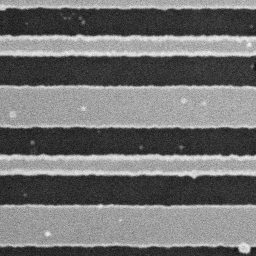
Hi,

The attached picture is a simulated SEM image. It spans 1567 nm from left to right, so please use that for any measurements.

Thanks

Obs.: lines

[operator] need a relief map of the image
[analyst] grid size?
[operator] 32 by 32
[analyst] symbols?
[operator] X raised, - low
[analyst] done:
XXXXXXXXXXXXXXXXXXXXXXXXXXXXXXXX
--------------------------------
--------------------------------
--------------------------------
XXXX-XXXXXX-XXX-XX--XX----XXX---
XXXXXXXXXXXXXXXXXXXXXXXXXXXXXXXX
XXXXXXXXXXXXXXXXXXXXXXXXXXXXXXXX
--------------------------------
--------------------------------
--------------------------------
--------------------------------
XXXXXXXXXXXXXXXXXXXXXXXXXXXXXXXX
XXXXXXXXXXXXXXXXXXXXXXXXXXXXXXXX
XXXXXXXXXXXXXXXXXXXXXXXXXXXXXXXX
XXXXXXXXXXXXXXXXXXXXXXXXXXXXXXXX
XXXXXXXXXXXXXXXXXXXXXXXXXXXXXXXX
--------------------------------
--------------------------------
--------------------------------
XXXXXXXXXXXXXXXXXXXXXXXXXXXXXXX-
XXXXXXXXXXXXXXXXXXXXXXXXXXXXXXXX
XXXXXXXXXXXXXXXXXXXXXXXXXXXXXXXX
--------------------------------
--------------------------------
--------------------------------
--------------------------------
XXXXXXXXXXXXXXXXXXXXXXXXXXXXXXXX
XXXXXXXXXXXXXXXXXXXXXXXXXXXXXXXX
XXXXXXXXXXXXXXXXXXXXXXXXXXXXXXXX
XXXXXXXXXXXXXXXXXXXXXXXXXXXXXXXX
XXXXXXXXXXXXXXXXXXXXXXXXXXXXXXXX
------------------------------X-